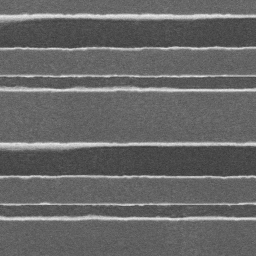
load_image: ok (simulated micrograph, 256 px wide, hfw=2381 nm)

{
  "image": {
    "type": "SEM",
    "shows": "lines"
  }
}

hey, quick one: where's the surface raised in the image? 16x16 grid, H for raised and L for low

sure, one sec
HHHHHHHHHHHHHHHH
LLLLLLLLLLLLLLLL
LLLLLLLLLLLLLLLL
HHHHHHHHHHHHHHHH
HHHHHHHHHHHHHHHH
HHHHHHHHHHHHHHHH
HHHHHHHHHHHHHHHH
HHHHHHHHHHHHHHHH
HHHHHHHHHHHHHHHH
LLLLLLLLLLLLLLLL
LLLLLLLLLLLLLLLL
HHHHHHHHHHHHHHHH
HHHHHHHHHHHHHHHH
HHHHHHHHHHHHHHHH
HHHHHHHHHHHHHHHH
HHHHHHHHHHHHHHHH